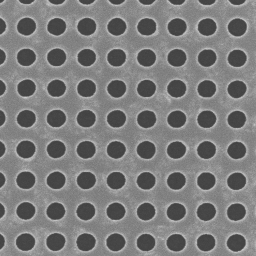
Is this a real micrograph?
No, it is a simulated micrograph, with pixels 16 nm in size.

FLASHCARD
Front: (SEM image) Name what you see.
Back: a regular array of holes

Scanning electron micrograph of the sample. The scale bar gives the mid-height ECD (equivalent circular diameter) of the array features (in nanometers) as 300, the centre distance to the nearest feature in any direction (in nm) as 481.